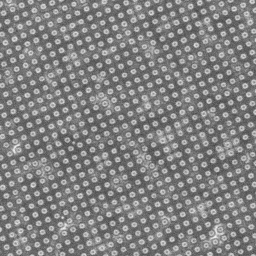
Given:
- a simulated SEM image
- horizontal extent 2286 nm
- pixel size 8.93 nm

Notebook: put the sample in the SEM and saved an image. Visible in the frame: a regular array of raised bodies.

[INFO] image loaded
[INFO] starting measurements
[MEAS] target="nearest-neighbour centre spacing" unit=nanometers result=83.1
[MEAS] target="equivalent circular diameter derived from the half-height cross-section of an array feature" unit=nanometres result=39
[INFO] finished